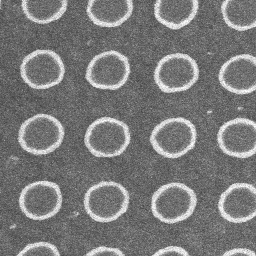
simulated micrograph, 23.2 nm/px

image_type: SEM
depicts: a regular array of raised bodies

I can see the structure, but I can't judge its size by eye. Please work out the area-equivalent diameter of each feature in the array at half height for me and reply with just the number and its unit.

890 nm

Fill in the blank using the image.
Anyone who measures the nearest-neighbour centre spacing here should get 1.5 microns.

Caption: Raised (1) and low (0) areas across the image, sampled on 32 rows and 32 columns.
00011111000111110000111100001111
00011111000111110000111100001111
00001100000011100000111100001111
00000000000000000000000000000010
00000000000000000000000000000000
00000000000000000000000000000000
00000100000000000000000000000000
00011110000011110000111100000111
00011111000111110000111100001111
00011111000111110000111110001111
00001110000011100000111100001111
00000000000000000000000000000000
00000000000000000000000000000000
00000000000000000000000000000000
00000100000000000000000000000000
00011110000011100000111100001111
00011111000111110001111100001111
00011110000111110001111100001111
00011110000111100000111100001111
00000000000000000000000000000000
00000000000000000000000000000000
00000000000000000000000000000000
00000000000000000000000000000000
00011110000011100000111000000110
00011111000111110001111100001111
00011110000111110001111100001111
00011110000111100001111100001111
00000000000000000000010000000100
00000000000000000000000000000000
00000000000000000000000000000000
00000000000000000000000000000000
00011110000011100000111000000110